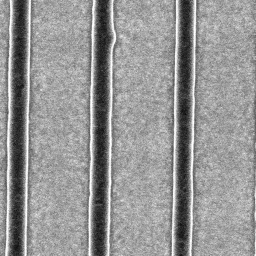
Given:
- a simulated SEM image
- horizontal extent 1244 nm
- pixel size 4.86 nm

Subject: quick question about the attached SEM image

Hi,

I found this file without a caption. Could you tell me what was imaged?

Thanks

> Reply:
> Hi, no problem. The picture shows one or a few lines or trenches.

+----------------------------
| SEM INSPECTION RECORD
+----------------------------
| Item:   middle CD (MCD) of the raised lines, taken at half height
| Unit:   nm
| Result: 96.2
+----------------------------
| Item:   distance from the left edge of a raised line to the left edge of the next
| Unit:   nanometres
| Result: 402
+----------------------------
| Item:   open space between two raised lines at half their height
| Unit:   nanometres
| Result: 306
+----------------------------